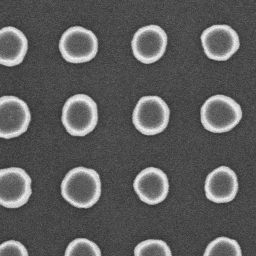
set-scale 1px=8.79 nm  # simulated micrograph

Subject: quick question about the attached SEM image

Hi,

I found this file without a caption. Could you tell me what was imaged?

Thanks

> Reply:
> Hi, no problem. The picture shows a regular array of raised bodies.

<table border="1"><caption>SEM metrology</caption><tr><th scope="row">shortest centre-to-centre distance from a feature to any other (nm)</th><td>619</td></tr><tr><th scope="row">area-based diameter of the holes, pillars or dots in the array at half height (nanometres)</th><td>305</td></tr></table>